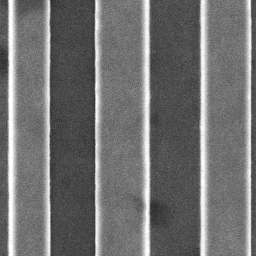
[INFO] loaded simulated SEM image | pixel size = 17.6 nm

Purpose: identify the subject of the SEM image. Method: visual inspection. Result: lines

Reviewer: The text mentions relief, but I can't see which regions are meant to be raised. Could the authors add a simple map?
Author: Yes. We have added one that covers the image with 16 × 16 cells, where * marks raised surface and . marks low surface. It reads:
.**...***....***
.**...***....***
.**...***....***
.**...***....***
.**...***....***
.**...***....***
.**...***....***
.**...***....***
.**...***....***
.**...***....***
.**...***....***
.**...***....***
.**...***....***
.**...***....***
.**...***....***
.**...***....***